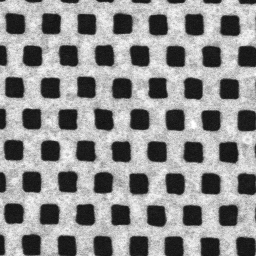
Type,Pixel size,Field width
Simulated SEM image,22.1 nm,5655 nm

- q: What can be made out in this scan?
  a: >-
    a regular array of holes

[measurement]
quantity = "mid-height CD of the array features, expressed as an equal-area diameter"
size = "480 nm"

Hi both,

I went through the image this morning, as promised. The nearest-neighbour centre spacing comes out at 787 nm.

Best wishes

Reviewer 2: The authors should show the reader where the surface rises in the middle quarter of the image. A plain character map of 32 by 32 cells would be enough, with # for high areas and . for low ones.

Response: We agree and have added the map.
...########.######...#####....##
################################
################################
###....######..#######...######.
###.....####.....####.....####..
###.....####.....####.....####..
###.....####.....####.....####..
###.....####.....####.....####..
######.######....#####...#####..
################################
################################
...#####...######...######...###
....###.....####.....####.....##
...####.....#####....####.....##
...####.....#####....####.....##
...#####....#####....####.....##
#########...######..######....##
################################
################################
###....######...#####....#####..
###.....####.....####.....####..
###.....####.....####.....####..
###.....####.....####.....####..
###.....####.....####.....####..
######.######...#######..######.
################################
################################
...#####....#####...######...###
...####.....####.....####.....##
...####.....####.....####.....##
...####.....####.....#####....##
...#####....####.....####.....##